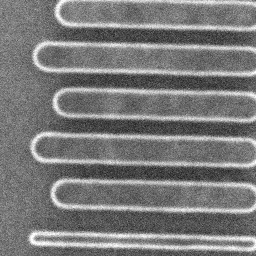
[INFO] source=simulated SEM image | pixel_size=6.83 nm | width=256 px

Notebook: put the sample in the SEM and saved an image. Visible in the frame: groups of lines, slits or small figures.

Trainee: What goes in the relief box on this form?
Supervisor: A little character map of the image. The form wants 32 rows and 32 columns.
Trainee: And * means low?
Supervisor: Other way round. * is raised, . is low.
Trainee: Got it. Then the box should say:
.......*************************
.......*************************
........************************
..........................******
................................
.....******.....................
....****************************
....****************************
.....***************************
................................
................................
........**************..........
.......*************************
.......*************************
............********************
................................
................................
....***************************.
....****************************
....****************************
.....................***********
................................
................................
.......*************************
.......*************************
.......*************************
................................
................................
................................
....*******************.........
......**************************
................................